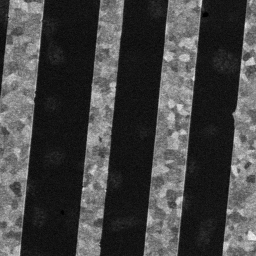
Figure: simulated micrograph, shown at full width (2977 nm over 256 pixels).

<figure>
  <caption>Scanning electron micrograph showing one or a few lines or trenches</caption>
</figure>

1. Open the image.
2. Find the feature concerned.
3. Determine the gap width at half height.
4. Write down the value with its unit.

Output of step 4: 531 nanometres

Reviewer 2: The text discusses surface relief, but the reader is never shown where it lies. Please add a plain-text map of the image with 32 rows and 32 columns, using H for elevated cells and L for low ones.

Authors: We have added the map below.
LHHHHLLLLLLLLHHLLLLLLHHHHLLLLLLH
LHHHHLLLLLLLHHHLLLLLLHHHHLLLLLLH
LHHHHLLLLLLLHHHLLLLLLHHHHLLLLLLH
LHHHHLLLLLLLHHHLLLLLLHHHHLLLLLLH
LHHHHLLLLLLLHHHLLLLLLHHHHLLLLLLH
LHHHHLLLLLLLHHHLLLLLLHHHHLLLLLHH
LHHHHLLLLLLLHHHLLLLLLHHHLLLLLLHH
LHHHHLLLLLLLHHHLLLLLHHHHLLLLLLHH
HHHHHLLLLLLLHHHLLLLLHHHHLLLLLLHH
HHHHHLLLLLLLHHHLLLLLHHHHLLLLLLHH
HHHHLLLLLLLLHHLLLLLLHHHHLLLLLLHH
HHHHLLLLLLLLHHLLLLLLHHHHLLLLLLHH
HHHHLLLLLLLLHHLLLLLLHHHHLLLLLLHH
HHHHLLLLLLLHHHLLLLLLHHHHLLLLLLHH
HHHHLLLLLLLHHHLLLLLLHHHHLLLLLHHH
HHHHLLLLLLLHHHLLLLLLHHHHLLLLLHHH
HHHHLLLLLLLHHHLLLLLLHHHHLLLLLHHH
HHHHLLLLLLLHHHLLLLLHHHHLLLLLLHHH
HHHHLLLLLLLHHHLLLLLHHHHLLLLLLHHH
HHHHLLLLLLLHHHLLLLLHHHHLLLLLLHHH
HHHLLLLLLLLHHHLLLLLHHHHLLLLLLHHH
HHHLLLLLLLLHHLLLLLLHHHHLLLLLLHHH
HHHLLLLLLLHHHLLLLLLHHHHLLLLLLHHH
HHHLLLLLLLHHHLLLLLLHHHHLLLLLLHHH
HHHLLLLLLLHHHLLLLLLHHHHLLLLLLHHH
HHHLLLLLLLHHHLLLLLLHHHHLLLLLHHHH
HHHLLLLLLLHHHLLLLLLHHHHLLLLLHHHH
HHHLLLLLLLHHHLLLLLHHHHHLLLLLHHHH
HHHLLLLLLLHHHLLLLLHHHHLLLLLLHHHH
HHHLLLLLLLHHHLLLLLHHHHLLLLLLHHHH
HHHLLLLLLLHHLLLLLLHHHHLLLLLLHHHH
HHLLLLLLLLHLLLLLLLHHHHLLLLLLHHHH